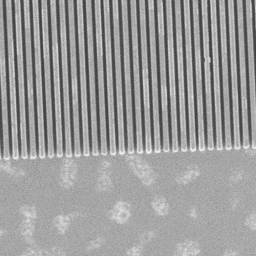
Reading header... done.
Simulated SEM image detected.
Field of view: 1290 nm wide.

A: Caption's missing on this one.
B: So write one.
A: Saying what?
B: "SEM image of parallel lines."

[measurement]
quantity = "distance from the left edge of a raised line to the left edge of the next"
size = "44.7 nanometers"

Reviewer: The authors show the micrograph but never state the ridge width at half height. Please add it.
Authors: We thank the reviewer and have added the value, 0.0295 um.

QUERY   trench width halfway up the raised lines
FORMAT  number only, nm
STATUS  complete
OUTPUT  17